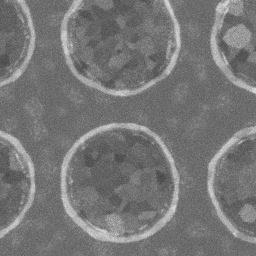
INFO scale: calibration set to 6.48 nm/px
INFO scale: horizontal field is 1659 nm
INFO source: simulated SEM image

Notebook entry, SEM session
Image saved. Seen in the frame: raised bodies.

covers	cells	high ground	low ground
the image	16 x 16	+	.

++...++++++...++
++..+++++++...++
++..+++++++..+++
++..+++++++...++
+....+++++....++
......+++.......
................
................
......++++.....+
+...++++++....++
++..+++++++..+++
++..+++++++..+++
++..+++++++..+++
+....+++++....++
......+++......+
................